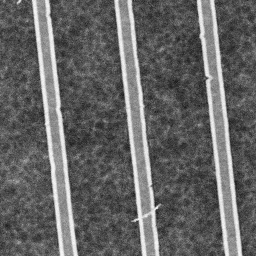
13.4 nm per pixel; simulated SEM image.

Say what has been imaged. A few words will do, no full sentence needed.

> one or a few lines or trenches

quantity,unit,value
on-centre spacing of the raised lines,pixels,82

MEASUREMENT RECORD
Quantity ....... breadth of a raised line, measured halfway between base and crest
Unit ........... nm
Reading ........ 167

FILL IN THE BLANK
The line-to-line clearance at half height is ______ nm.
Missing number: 933